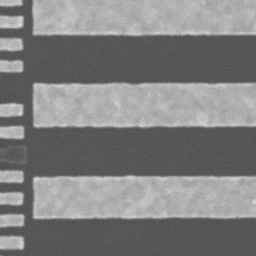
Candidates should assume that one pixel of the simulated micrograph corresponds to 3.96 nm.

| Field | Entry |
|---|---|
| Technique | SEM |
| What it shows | wiring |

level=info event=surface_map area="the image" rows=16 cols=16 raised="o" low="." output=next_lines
..oooooooooooooo
o.oooooooooooooo
o...............
................
................
..oooooooooooooo
..oooooooooooooo
..oooooooooooooo
o...............
oo..............
................
..oooooooooooooo
o.oooooooooooooo
o.oooooooooooooo
................
................